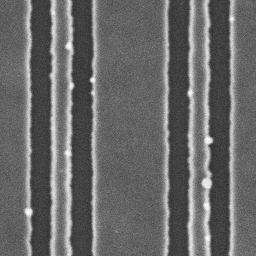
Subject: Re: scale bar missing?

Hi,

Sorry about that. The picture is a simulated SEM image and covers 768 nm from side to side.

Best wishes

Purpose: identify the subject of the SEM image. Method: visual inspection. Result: lines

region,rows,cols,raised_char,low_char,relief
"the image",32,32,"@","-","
@@@@---@@---@@@@@@@@@---@@---@@@
@@@@--@@@---@@@@@@@@@---@@---@@@
@@@@---@@---@@@@@@@@@---@@---@@@
@@@@---@@---@@@@@@@@@---@@---@@@
@@@@---@@---@@@@@@@@@---@@---@@@
@@@@--@@@---@@@@@@@@@---@@---@@@
@@@@--@@@---@@@@@@@@@---@@---@@@
@@@@---@@---@@@@@@@@@---@@---@@@
@@@@---@@---@@@@@@@@@---@@---@@@
@@@@--@@@---@@@@@@@@@---@@---@@@
@@@@---@@--@@@@@@@@@@---@@---@@@
@@@@---@@---@@@@@@@@@---@@---@@@
@@@@---@@---@@@@@@@@@---@@---@@@
@@@@---@@---@@@@@@@@@---@@---@@@
@@@@--@@@---@@@@@@@@@---@@---@@@
@@@@--@@@---@@@@@@@@@---@@---@@@
@@@@--@@@---@@@@@@@@@---@@---@@@
@@@@---@@---@@@@@@@@@---@@---@@@
@@@@---@@---@@@@@@@@@---@@---@@@
@@@@---@@---@@@@@@@@@---@@---@@@
@@@@---@@---@@@@@@@@@---@@---@@@
@@@@---@@---@@@@@@@@@---@@---@@@
@@@@--@@@---@@@@@@@@@---@@---@@@
@@@@---@@---@@@@@@@@@---@@---@@@
@@@@---@@---@@@@@@@@@---@@---@@@
@@@@---@@---@@@@@@@@@---@@---@@@
@@@@--@@@---@@@@@@@@@---@@---@@@
@@@@--@@@---@@@@@@@@@---@@---@@@
@@@@---@@---@@@@@@@@@---@@---@@@
@@@@---@@---@@@@@@@@@---@@---@@@
@@@@--@@@---@@@@@@@@@---@@---@@@
@@@@--@@@---@@@@@@@@@---@@---@@@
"